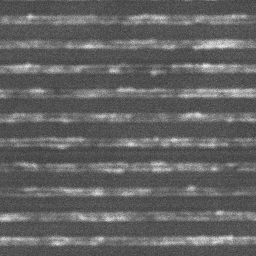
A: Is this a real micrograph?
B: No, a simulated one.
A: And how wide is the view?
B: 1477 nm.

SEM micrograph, parallel lines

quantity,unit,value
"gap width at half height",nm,102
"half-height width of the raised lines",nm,39.6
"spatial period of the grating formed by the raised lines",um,0.142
